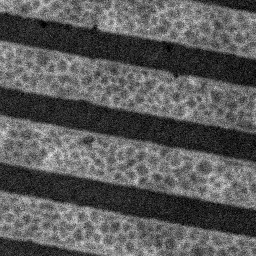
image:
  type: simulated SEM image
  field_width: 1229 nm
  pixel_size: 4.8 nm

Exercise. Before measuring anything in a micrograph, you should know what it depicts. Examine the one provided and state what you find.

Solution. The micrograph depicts one or a few lines or trenches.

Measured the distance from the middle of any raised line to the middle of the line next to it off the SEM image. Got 0.354 um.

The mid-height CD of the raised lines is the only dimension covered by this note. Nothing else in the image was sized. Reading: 204 nanometers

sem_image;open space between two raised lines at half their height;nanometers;151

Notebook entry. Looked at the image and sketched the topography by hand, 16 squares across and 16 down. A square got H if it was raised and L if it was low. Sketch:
HHHHHHHHHHHHHHLL
LLLLLHHHHHHHHHHH
LLLLLLLLLLHHHHHH
HHHHHLLLLLLLLLLL
HHHHHHHHHHLLLLLL
LHHHHHHHHHHHHHHL
LLLLLLHHHHHHHHHH
HLLLLLLLLLLLHHHH
HHHHHHLLLLLLLLLL
HHHHHHHHHHHHLLLL
LLHHHHHHHHHHHHHH
LLLLLLLLHHHHHHHH
HHHLLLLLLLLLLHHH
HHHHHHHHLLLLLLLL
HHHHHHHHHHHHHHLL
LLLLHHHHHHHHHHHH